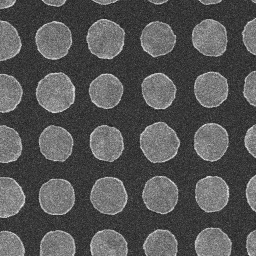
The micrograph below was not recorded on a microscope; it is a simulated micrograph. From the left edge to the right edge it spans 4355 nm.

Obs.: a regular array of raised bodies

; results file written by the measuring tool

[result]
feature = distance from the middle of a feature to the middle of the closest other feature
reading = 877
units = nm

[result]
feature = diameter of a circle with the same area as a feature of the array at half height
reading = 612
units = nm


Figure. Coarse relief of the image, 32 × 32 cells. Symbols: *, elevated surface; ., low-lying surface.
**....**........................
................................
..........................*.....
**...***...****...***...****...*
**...****..****...****..****..**
***..****..****...****..****...*
**...***....***...***....***...*
................................
................................
*.....**.....*.....**....***...*
**...****..****...****..****...*
***..****..****...****..****...*
**...****..****...****...***...*
**....**.....*.....**...........
................................
...................**.....*.....
**...***....***...****...***...*
***..****..****...****..****...*
***..****..****...****..****...*
**....***...***...****...***....
................................
................................
**....**....***....**....***...*
***..****...****..****...***...*
***..****..*****..****...***...*
***..****...****..****...***...*
**....**.....**....**...........
................................
................................
**....***...***....***...***...*
***..****..*****..****..*****..*
***..****..*****..****...****..*